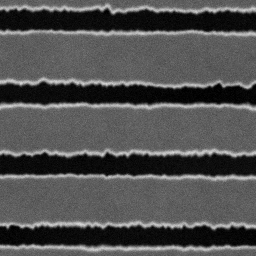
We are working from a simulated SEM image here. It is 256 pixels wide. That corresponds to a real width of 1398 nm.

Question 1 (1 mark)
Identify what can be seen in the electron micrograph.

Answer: lines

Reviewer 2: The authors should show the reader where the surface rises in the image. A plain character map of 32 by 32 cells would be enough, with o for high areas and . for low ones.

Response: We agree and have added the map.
oooooooooooooooooooooooooooooooo
..............oo.......oo.......
................................
................................
oooooooooooooooooooooooooooooooo
oooooooooooooooooooooooooooooooo
oooooooooooooooooooooooooooooooo
oooooooooooooooooooooooooooooooo
oooooooooooooooooooooooooooooooo
oooooooooooooooooooooooooooooooo
..o.o.....oo.ooooooooooooooooooo
................................
................................
oooooooooooooooooooooooooooooooo
oooooooooooooooooooooooooooooooo
oooooooooooooooooooooooooooooooo
oooooooooooooooooooooooooooooooo
oooooooooooooooooooooooooooooooo
oooooooooooooooooooooooooooooooo
........o....................o..
................................
................................
oooooooooooooooooooooooooooooooo
oooooooooooooooooooooooooooooooo
oooooooooooooooooooooooooooooooo
oooooooooooooooooooooooooooooooo
oooooooooooooooooooooooooooooooo
oooooooooooooooooooooooooooooooo
..........................o.o..o
................................
................................
oooooooooooooooooooooooooooooooo